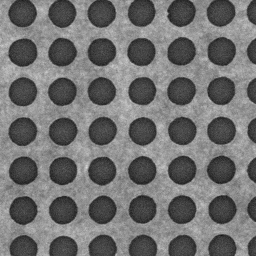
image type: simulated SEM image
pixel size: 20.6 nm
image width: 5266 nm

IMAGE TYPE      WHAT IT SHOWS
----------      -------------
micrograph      a regular array of holes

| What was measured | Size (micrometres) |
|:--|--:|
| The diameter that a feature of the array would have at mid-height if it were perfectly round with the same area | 0.59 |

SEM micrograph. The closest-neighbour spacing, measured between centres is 808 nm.